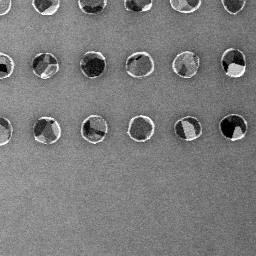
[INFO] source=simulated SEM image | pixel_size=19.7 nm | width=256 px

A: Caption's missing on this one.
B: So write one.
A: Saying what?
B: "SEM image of a regular array of raised bodies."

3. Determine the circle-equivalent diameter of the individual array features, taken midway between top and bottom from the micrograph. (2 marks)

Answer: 507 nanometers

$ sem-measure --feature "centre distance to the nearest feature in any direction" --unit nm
919